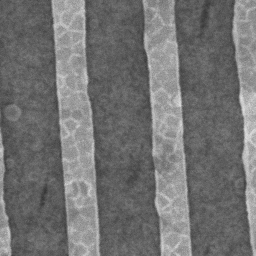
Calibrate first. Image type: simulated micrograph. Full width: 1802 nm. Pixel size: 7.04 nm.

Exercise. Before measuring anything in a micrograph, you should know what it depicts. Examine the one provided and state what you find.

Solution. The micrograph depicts one or a few lines or trenches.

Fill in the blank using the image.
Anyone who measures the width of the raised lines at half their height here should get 0.207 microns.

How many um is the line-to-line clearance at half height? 0.432